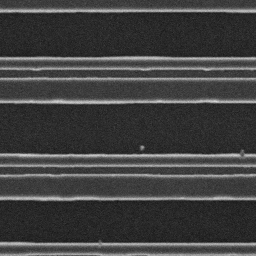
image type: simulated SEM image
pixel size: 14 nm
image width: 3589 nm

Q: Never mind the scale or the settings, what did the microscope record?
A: lines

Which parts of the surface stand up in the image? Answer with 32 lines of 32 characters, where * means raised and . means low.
********************************
................................
................................
................................
................................
................................
................................
********************************
********************************
********************************
********************************
********************************
********************************
................................
................................
................................
................................
................................
................................
********************************
********************************
********************************
********************************
********************************
********************************
................................
................................
................................
................................
................................
............*...................
********************************